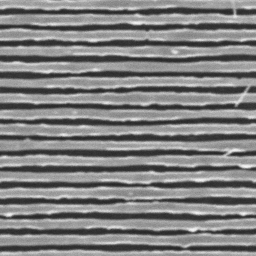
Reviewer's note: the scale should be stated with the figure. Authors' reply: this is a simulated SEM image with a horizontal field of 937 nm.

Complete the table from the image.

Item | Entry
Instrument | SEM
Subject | parallel lines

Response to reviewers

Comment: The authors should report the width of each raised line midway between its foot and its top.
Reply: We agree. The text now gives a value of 36.6 nm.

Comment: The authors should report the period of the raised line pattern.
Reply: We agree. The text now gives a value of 57.7 nanometers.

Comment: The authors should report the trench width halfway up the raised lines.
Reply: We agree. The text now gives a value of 20.2 nm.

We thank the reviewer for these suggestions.